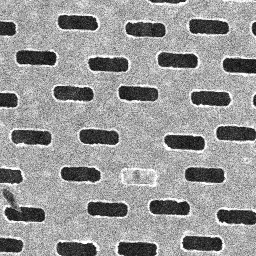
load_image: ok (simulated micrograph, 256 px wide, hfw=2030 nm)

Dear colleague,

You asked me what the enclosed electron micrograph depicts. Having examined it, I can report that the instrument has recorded a regular array of holes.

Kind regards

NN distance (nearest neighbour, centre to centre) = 354 nanometres